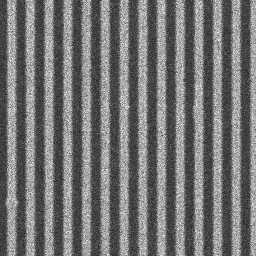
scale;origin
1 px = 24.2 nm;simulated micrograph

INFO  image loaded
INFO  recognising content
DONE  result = parallel lines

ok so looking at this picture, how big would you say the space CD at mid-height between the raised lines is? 245 nm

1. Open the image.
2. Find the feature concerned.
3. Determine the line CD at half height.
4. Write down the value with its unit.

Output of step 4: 206 nm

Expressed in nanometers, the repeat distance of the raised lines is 452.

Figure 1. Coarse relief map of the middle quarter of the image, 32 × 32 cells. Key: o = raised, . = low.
oo...oo..oo...oo...oo..oo...oo..
oo...oo..oo...oo...oo..oo...oo..
oo...oo..oo...oo...oo..oo...oo..
oo...oo..oo...oo...oo..oo...oo..
oo...oo..oo...oo...oo..oo...oo..
oo...oo..oo...oo...oo..oo...oo..
oo...oo..oo...oo...oo..oo...oo..
oo...oo..oo...oo...oo..oo...oo..
oo...oo..oo...oo...oo..oo...oo..
oo...oo..oo...oo...oo..oo...oo..
oo...oo..oo...oo...oo..oo...oo..
oo...oo..oo...oo...oo..oo...oo..
oo...oo..oo...oo...oo..oo...oo..
oo...oo..oo...oo...oo..oo...oo..
oo...oo..oo...oo...oo..oo...oo..
oo...oo..oo...oo...oo..oo...oo..
oo...oo..oo...oo...oo..oo...oo..
oo...oo..oo...oo...oo..oo...oo..
oo...oo..oo...oo...oo..oo...oo..
oo...oo..oo...oo...oo..oo...oo..
oo...oo..oo...oo...oo..oo...oo..
oo...oo..oo...oo...oo..oo...oo..
oo...oo..oo...oo...oo..oo...oo..
oo...oo..oo...oo...oo..oo...oo..
oo...oo..oo...oo...oo..oo...oo..
oo...oo..oo...oo...oo..oo...oo..
oo...oo..oo...oo...oo..oo...oo..
oo...oo..oo...oo...oo..oo...oo..
oo...oo..oo...oo...oo..oo...oo..
oo...oo..oo...oo...oo..oo...oo..
oo...oo..oo...oo...oo..oo...oo..
oo...oo..oo...oo...oo..oo...oo..